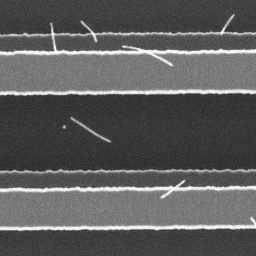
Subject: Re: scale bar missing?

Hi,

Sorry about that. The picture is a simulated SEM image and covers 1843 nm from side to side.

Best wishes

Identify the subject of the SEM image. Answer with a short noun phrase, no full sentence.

lines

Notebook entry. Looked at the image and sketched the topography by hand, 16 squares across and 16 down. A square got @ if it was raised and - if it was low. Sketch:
----------------
----------------
@@@@@@@@@@@@@@@@
@@@@@@@@@@@@@@@@
@@@@@@@@@@@@@@@@
@@@@@@@@@@@@@@@@
----------------
----------------
----------------
----------------
----------------
@@@@@@@@@@@@@@@@
@@@@@@@@@@@@@@@@
@@@@@@@@@@@@@@@@
----------------
----------------